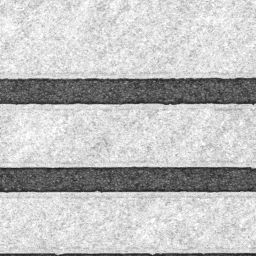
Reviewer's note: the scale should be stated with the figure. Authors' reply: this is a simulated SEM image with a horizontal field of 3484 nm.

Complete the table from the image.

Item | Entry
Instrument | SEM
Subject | one or a few lines or trenches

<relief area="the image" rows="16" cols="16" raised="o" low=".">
oooooooooooooooo
oooooooooooooooo
oooooooooooooooo
oooooooooooooooo
oooooooooooooooo
................
................
oooooooooooooooo
oooooooooooooooo
oooooooooooooooo
................
................
oooooooooooooooo
oooooooooooooooo
oooooooooooooooo
oooooooooooooooo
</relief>